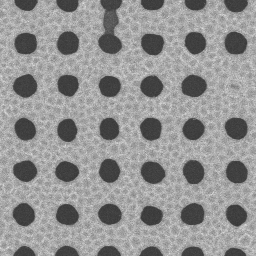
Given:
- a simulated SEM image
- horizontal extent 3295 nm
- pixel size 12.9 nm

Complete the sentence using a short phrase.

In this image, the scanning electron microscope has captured a regular array of holes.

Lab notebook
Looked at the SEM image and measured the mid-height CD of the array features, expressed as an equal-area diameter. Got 22.1 pixels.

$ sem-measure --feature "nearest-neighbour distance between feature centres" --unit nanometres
537